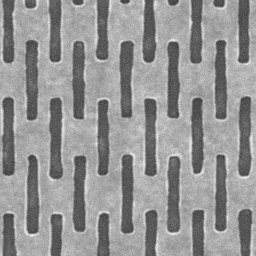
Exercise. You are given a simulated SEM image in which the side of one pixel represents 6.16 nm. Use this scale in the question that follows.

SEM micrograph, a regular array of holes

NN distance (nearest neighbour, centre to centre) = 47 pixels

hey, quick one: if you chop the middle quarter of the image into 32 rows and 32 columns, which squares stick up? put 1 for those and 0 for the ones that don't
11000111111111000111111111000111
11000111111111000111111111000111
11000111111111000111111111000111
11000111111111000111111111000111
11000111111111000111111111000111
11000111111111000111111111000111
11000111111111000111111111000111
11000111111111000111111111000111
11000111111111000111001111000111
11000111100111000111000111000111
11000111000111000111000111000111
11000111000111000111000111000111
11000111000111000111000011000111
11100111000111100111000111100111
11111111000111111111000111111111
11111111000111111111000111111111
11111111000111111111000111111111
11111111000111111111000111111111
11111111000111111111000111111111
11111111000111111111000111111111
11111111000011111111000111111111
11111111000011111111000111111111
11111111000111110111000111111111
11000011000111000011000111000111
11000011000111000011000111000111
11000011000111000111000111000111
11000011000111000111000111000111
11000011100111000111000111000111
11000011111111000011111111000111
11000011111111000011111111000111
11000111111111000111111111000111
11000111111111000111111111000111